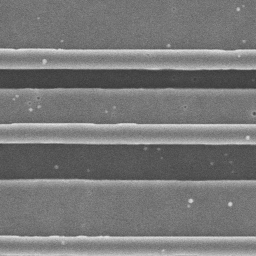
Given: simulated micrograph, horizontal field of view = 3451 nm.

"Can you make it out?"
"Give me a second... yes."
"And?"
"lines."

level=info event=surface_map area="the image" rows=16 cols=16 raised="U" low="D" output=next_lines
UUUUUUUUUUUUUUUU
UUUUUUUUUUUUUUUU
UUUUUUUUUUUUUUUU
UUUUUUUUUUUUUUUU
DDDDDDDDDDDDDDDD
DDDDDDDDDDDDDDDD
UUUUUUUUUUUUUUUU
UUUUUUUUUUUUUUUU
UUUUUUUUUUUUUUUU
DDDDDDDDDDDDDDDD
DDDDDDDDDDDDDDDD
UUUUUUUUUUUUUUUU
UUUUUUUUUUUUUUUU
UUUUUUUUUUUUUUUU
UUUUUUUUUUUUUUUU
UUUUUUUUUUUUUUUU